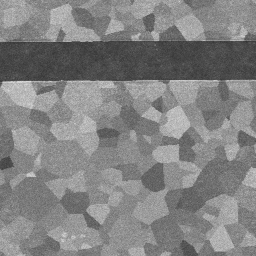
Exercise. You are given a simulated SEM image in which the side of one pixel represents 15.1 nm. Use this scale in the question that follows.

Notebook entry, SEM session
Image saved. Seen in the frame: one or a few lines or trenches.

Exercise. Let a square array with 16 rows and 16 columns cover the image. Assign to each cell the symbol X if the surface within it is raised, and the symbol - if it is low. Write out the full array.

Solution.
XXXXXXXXXXXXXXXX
XXXXXXXXXXXXXXXX
XXXXXXXXXXX-----
----------------
----------------
XXXXXXXXXXXXXXXX
XXXXXXXXXXXXXXXX
XXXXXXXXXXXXXXXX
XXXXXXXXXXXXXXXX
XXXXXXXXXXXXXXXX
XXXXXXXXXXXXXXXX
XXXXXXXXXXXXXXXX
XXXXXXXXXXXXXXXX
XXXXXXXXXXXXXXXX
XXXXXXXXXXXXXXXX
XXXXXXXXXXXXXXXX